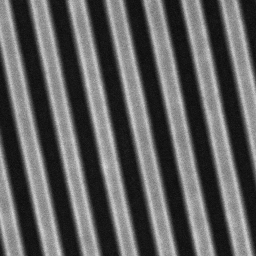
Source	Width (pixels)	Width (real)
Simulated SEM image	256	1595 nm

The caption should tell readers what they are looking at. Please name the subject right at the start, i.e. parallel lines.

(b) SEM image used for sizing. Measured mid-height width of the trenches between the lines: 127 nm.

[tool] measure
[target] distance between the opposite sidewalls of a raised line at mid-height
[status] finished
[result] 104 nm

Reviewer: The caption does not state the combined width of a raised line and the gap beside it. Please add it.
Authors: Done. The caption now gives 232 nm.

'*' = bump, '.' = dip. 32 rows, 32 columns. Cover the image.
*...**...**..**...**...**...**..
*...**...**..***..***..**...**..
**..**...**...**..***..**...**..
**..***..**...**...**..***..**..
**...**..***..**...**...**..***.
**...**...**..**...**...**...**.
**...**...**...**..***..**...**.
***..**...**...**...**..**...**.
.**...**..**...**...**..***..**.
.**...**..***..**...**...**...**
.**...**...**..***..**...**...**
.***..**...**...**..***..**...**
.***..**...**...**...**..***..**
..**..***..**...**...**...**..**
..**...**...**..**...**...**...*
..**...**...**..***..**...**...*
..**...**...**...**..***..**...*
...**..**...**...**...**..***..*
...**..***..**...**...**...**..*
...**...**...**..***..**...**..*
*..**...**...**..***..**...**...
*..***..**...**...**..***..**...
*...**..**...**...**...**..***..
*...**...**..**...**...**...**..
**..**...**...**..***..**...**..
**..**...**...**...**..**...**..
**..***..**...**...**..***..**..
**...**..**...**...**...**..***.
**...**...**..**...**...**...**.
**...**...**...**..***..**...**.
.**..**...**...**...**..***..**.
.**..***..**...**...**...**..***